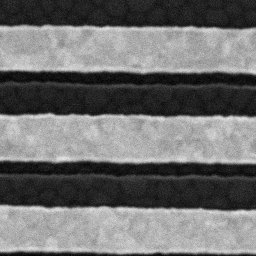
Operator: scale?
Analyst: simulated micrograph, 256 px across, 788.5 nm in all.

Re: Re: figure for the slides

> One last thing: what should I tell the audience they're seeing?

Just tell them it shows lines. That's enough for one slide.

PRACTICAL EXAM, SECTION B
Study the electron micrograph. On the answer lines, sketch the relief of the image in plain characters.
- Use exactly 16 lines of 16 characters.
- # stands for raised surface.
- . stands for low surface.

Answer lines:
................
................
################
################
........#####.##
................
................
################
################
################
................
................
................
################
################
################